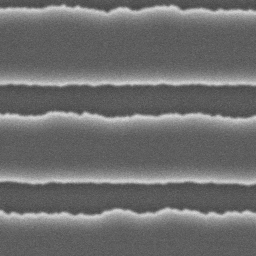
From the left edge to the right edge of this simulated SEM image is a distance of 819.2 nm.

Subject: lines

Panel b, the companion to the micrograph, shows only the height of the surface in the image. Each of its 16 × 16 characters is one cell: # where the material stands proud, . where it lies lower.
...##....##.....
################
################
################
################
................
................
################
################
################
################
...............#
................
################
################
################